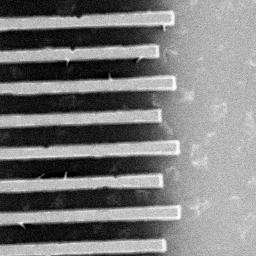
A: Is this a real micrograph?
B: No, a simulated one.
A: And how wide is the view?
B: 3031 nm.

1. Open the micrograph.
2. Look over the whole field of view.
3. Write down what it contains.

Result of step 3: parallel lines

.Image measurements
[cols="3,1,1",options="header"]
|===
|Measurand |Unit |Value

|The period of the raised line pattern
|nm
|384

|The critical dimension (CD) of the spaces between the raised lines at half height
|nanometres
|243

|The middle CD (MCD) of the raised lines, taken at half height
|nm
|138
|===